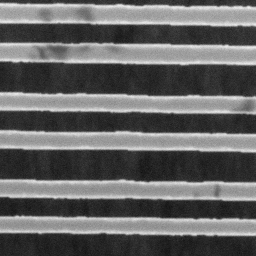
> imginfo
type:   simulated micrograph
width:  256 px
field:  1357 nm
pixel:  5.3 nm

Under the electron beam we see lines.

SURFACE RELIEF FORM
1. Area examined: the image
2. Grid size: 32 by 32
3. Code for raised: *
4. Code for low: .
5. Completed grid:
**..............................
********************************
********************************
................................
................................
******....**....................
********************************
********************************
................................
................................
................................
................................
********************************
********************************
................................
................................
****............................
********************************
...*****************************
................................
................................
................................
................................
********************************
********************************
................................
................................
************************....*...
********************************
................................
................................
................................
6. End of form